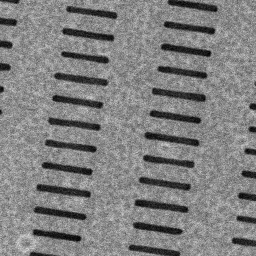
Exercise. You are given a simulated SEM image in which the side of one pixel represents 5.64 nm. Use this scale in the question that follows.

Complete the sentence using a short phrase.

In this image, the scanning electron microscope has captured a regular array of holes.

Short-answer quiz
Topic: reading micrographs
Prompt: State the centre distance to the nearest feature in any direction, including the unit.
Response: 127 nanometers